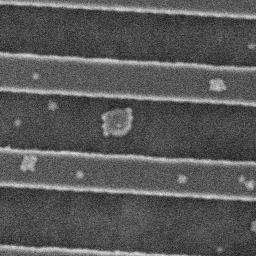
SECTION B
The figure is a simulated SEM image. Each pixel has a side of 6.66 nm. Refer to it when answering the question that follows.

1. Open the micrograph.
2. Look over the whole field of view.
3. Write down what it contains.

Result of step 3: lines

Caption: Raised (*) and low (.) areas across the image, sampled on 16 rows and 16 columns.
.....***********
................
................
***.............
****************
****************
...............*
................
................
*****...........
****************
****************
................
................
................
**..............